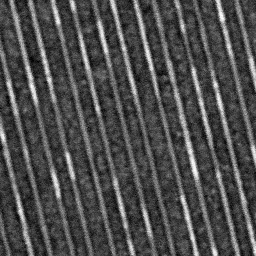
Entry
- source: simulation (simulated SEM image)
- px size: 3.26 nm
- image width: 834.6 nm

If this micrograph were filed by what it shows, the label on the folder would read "parallel lines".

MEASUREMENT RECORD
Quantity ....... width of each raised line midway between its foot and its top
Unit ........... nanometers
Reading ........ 11.9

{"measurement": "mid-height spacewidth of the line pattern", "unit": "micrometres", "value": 0.0471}